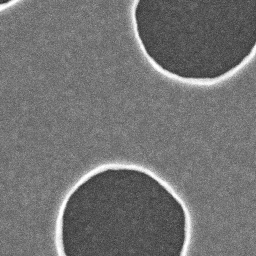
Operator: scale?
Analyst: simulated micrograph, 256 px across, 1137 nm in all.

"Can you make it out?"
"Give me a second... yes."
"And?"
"holes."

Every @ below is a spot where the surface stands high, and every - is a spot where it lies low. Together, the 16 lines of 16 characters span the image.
@@@@@@@@--------
@@@@@@@@@-------
@@@@@@@@@-------
@@@@@@@@@------@
@@@@@@@@@@@---@@
@@@@@@@@@@@@@@@@
@@@@@@@@@@@@@@@@
@@@@@@@@@@@@@@@@
@@@@@@@@@@@@@@@@
@@@@@@@@@@@@@@@@
@@@@@@@-@@@@@@@@
@@@@@-----@@@@@@
@@@@-------@@@@@
@@@@--------@@@@
@@@@--------@@@@
@@@@-------@@@@@